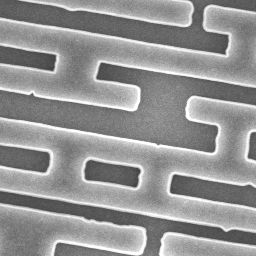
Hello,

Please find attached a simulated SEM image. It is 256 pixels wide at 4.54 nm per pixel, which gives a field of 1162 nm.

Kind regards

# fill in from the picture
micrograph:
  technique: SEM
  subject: parallel lines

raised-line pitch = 0.216 microns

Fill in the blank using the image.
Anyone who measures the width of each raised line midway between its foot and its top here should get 116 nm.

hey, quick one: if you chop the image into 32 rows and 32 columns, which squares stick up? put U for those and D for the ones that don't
DDDDDDUUUUUUUUUUUUUUUUUUDDDDDDDD
DDDDDDDDDDDDUUUUUUUUUUUUDDUUUUUD
UDDDDDDDDDDDDDDDDDUUUUUUDDUUUUUU
UUUUUUUUDDDDDDDDDDDDDDDDDDUUUUUU
UUUUUUUUUUUUUUDDDDDDDDDDDDDDUUUU
UUUUUUUUUUUUUUUUUUUDDDDDDDDDDUUU
DDDDDUUUUUUUUUUUUUUUUUUUUUDDUUUU
DDDDDDDUUUUUUUUUUUUUUUUUUUUUUUUU
UUUUDDDUUUUUDDDDDUUUUUUUUUUUUUUU
UUUUUUUUUUUUDDDDDDDDDDDDUUUUUUUU
UUUUUUUUUUUUUUUDDDDDDDDDDDDDDDUU
DDUUUUUUUUUUUUUUUDDDDDDDDDDDDDDD
DDDDDDDDUUUUUUUUUDDDDDDDUUUDDDDD
DDDDDDDDDDDDDDUUUDDDDDDUUUUUUUUU
DDDDDDDDDDDDDDDDDDDDDDDUUUUUUUUU
UUUUUDDDDDDDDDDDDDDDDDDDDDUUUUUU
UUUUUUUUUUDDDDDDDDDDDDDDDDDUUUUU
UUUUUUUUUUUUUUUUDDDDDDDDDDDUUUUD
DDDUUUUUUUUUUUUUUUUUUUDDDDDUUUUD
DDDDDDUUUUUUUUUUUUUUUUUUUUUUUUUD
DDDDDDUUUUUDDDDUUUUUUUUUUUUUUUUU
UUUUDDUUUUDDDDDDDDUUUUUUUUUUUUUU
UUUUUUUUUUUDDDDDDUUUUDDDDDUUUUUU
UUUUUUUUUUUUUUUUUUUUUDDDDDDDDDDD
DDDDDUUUUUUUUUUUUUUUUUUDDDDDDDDD
DDDDDDDDDDUUUUUUUUUUUUUUUUUUDDDD
UUUUUUDDDDDDDDDDDUUUUUUUUUUUUUUU
UUUUUUUUUUUDDDDDDDDDDDUUUUUUUUUU
UUUUUUUUUUUUUUUUUUDDDDDDDDDDUUUU
UUUUUUUUUUUUUUUUUUDDDUUUDDDDDDDD
UUUUUUUDDUUUUUUUUUDDUUUUUUUUUUDD
UUUUUUUDDDDDDDDUUUDDUUUUUUUUUUUU